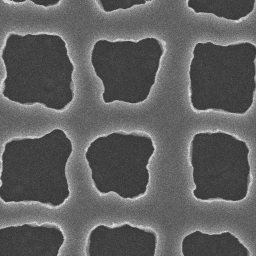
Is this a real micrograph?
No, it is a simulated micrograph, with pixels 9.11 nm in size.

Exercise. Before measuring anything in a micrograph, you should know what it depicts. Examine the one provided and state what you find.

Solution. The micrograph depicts holes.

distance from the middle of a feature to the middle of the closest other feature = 841 nanometers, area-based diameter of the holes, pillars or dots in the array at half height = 613 nm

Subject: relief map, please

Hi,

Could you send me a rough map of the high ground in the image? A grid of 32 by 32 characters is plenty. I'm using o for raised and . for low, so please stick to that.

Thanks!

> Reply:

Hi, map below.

ooooo..ooooo......oooooo........
ooooooooooooooooooooooooo......o
oooooooooooooooooooooooooooooooo
oooooooooooooooooooooooooooooooo
o......ooooooooooooooooooooooooo
o.......oooo........ooooo..ooo.o
........oooo........oooo........
.........oo.........oooo........
o........ooo........oooo........
o........ooo.......ooooo........
o........oooo......ooooo........
.........oooo......ooooo........
o........oooo.....oooooo........
oooooo..oooooooooooooooo.......o
oooooooooooooooooooooooooooooooo
oooooooooooooooooooooooooooooooo
oooooo..oooooooooooooooooooooooo
oo.......ooo.......ooooo......oo
o........oo........ooooo.......o
.........oo........ooooo.......o
........ooo.......oooooo.......o
........ooo........ooooo.......o
........oooo.......ooooo.......o
.........ooo......oooooo.......o
.........oooooo..ooooooo.......o
oooooo..oooooooooooooooooooooooo
oooooooooooooooooooooooooooooooo
oooooooooooooooooooooooooooooooo
.......ooooo.....ooooooooooooooo
........ooo.........ooo......ooo
........ooo.........ooo.......oo
.......oooo........oooo........o